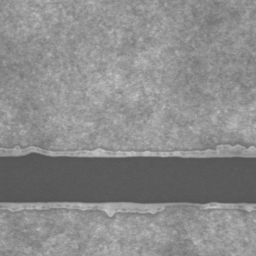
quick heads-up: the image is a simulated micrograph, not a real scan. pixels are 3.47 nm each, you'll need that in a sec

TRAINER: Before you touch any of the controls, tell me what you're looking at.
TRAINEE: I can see one or a few lines or trenches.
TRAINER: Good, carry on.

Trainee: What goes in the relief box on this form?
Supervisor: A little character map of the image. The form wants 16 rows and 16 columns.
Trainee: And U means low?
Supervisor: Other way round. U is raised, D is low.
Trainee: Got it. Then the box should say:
UUUUUUUUUUUUUUUU
UUUUUUUUUUUUUUUU
UUUUUUUUUUUUUUUU
UUUUUUUUUUUUUUUU
UUUUUUUUUUUUUUUU
UUUUUUUUUUUUUUUU
UUUUUUUUUUUUUUUU
UUUUUUUUUUUUUUUU
UUUUUUUUUUUUUUUU
UUUUUUUUUUUUUUUU
DDDDDDDDDDDDDDDD
DDDDDDDDDDDDDDDD
DDDDDDDDDDDDDDDD
UUUUUUUUUUUUUUUU
UUUUUUUUUUUUUUUU
UUUUUUUUUUUUUUUU